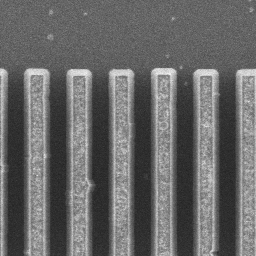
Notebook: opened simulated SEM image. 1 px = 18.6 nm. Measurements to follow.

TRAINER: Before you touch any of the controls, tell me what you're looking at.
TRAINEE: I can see parallel lines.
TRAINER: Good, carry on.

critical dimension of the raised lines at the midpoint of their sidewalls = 0.363 microns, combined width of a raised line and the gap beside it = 788 nm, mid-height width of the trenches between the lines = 412 nm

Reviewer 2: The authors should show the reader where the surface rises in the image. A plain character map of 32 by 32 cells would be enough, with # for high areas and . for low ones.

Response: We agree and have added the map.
................................
................................
................................
................................
................................
................................
................................
................................
................................
#..###...##...##...###...##...##
#..###...##...##...###...##...##
#..###...##...##...###...##...##
#..###...##...##...###...##...##
#..###...##...##...###...##...##
#..###...##...##...###...##...##
#..###...##...##...###...##...##
#..###...##...##...###...##...##
#..###...##...##...###...##...##
#..###...##...##...###...##...##
#..###...##...##...###...##...##
#..###...##...##...###...##...##
#..###...##...##...###...##...##
#..###...##...##...###...##...##
#..###...##...##...###...##...##
#..###...##...##...###...##...##
#..###...##...##...###...##...##
#..###...##...##...###...##...##
#..###...##...##...###...##...##
#..###...##...##...###...##...##
#..###...##...##...###...##...##
#..###...##...##...###...##...##
#..###...##...##...###...##...##